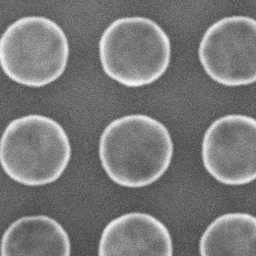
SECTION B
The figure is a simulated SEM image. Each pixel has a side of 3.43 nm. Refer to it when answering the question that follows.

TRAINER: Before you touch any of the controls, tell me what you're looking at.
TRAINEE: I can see raised bodies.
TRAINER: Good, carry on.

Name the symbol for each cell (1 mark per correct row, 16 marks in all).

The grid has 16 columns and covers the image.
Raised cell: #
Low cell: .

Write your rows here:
................
.##....###....##
####..####...###
####..#####..###
####...###...###
................
................
.##....###....##
####..#####..###
####..#####..###
####...###...###
........#.......
................
........#.....##
####...###...###
####..#####..###